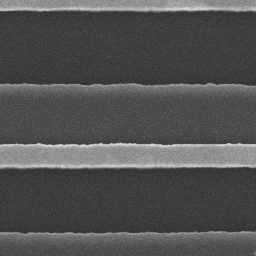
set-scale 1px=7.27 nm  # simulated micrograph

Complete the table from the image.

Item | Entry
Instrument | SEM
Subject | lines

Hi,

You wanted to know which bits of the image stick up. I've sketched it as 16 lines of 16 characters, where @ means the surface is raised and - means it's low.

@@@@@@@@@@@@@@@@
----------------
----------------
----------------
----------------
@@@@@@@@@@@@@@@@
@@@@@@@@@@@@@@@@
@@@@@@@@@@@@@@@@
@@@@@@@@@@@@@@@@
@@@@@@@@@@@@@@@@
----------------
----------------
----------------
----------------
-------------@-@
@@@@@@@@@@@@@@@@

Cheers